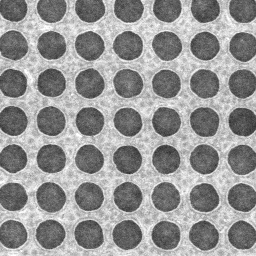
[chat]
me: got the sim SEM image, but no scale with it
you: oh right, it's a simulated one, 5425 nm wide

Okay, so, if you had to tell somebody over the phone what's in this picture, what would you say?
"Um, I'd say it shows a regular array of holes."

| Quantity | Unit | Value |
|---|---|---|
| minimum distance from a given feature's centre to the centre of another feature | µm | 0.797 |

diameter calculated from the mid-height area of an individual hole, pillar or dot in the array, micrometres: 0.635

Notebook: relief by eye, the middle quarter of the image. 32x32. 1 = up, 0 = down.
11111111111111111111111111111111
11111000111111000111111100011111
11100000011110000001111000001111
11100000001100000000110000000111
01100000001100000000110000000110
01100000001100000000110000000110
11100000001110000000110000000111
11100000011110000001111000001111
11111000111111101111111110011111
11111111111111111111111111111111
11111111111111111111111111111111
11110000111111000011111000001111
11100000001110000001110000000111
11100000001100000001110000000110
01100000001100000000110000000110
11100000001110000000110000000111
11100000001110000001111000000111
11110000111111000001111000001111
11111111111111111111111111111111
11111111111111111111111111111111
11111000111111100111111100011111
11100000011110000001111000001111
11100000001100000001110000000111
01100000001100000000110000000110
01100000001100000001110000000110
11100000001110000001110000000111
11110000011110000001111000001111
11111101111111100111111110011111
11111111111111111111111111111111
11111001111111100111111110011111
11110000011111000001111000001111
11100000001110000001110000000111